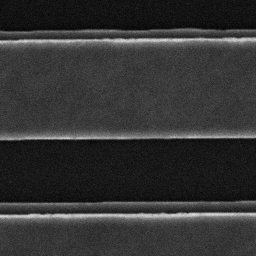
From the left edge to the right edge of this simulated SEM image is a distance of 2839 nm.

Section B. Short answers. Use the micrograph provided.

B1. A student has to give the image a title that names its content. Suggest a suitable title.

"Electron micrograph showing lines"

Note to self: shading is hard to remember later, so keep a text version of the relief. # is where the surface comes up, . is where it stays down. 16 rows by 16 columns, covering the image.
................
................
.....###########
################
################
################
################
################
################
................
................
................
................
################
################
################